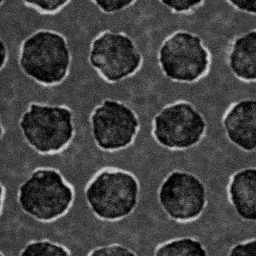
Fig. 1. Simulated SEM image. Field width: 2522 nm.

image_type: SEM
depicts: a regular array of holes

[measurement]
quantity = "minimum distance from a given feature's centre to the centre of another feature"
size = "658 nanometers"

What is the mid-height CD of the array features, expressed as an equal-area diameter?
0.476 microns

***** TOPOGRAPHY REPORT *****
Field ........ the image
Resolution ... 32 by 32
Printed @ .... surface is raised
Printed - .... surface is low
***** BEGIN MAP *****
@@@@----@@@@----@@@@@---@@@@@---
@@@@@@@@@@@@@@@@@@@@@@@@@@@@@@@-
@@@@@@@@@@@@@@@@@@@@@@@@@@@@@@@@
@@@@@@@@@@@@@@@@@@@@@@@@@@@@@@@@
@@@@----@@@@---@@@@@@@--@@@@@@@-
@@@-----@@@------@@@-----@@@@---
-@@------@@------@@@------@@@---
-@@------@@------@@@------@@@---
@@@-----@@@@-----@@@------@@@---
@@@@----@@@@@---@@@@@----@@@@@--
@@@@@@@@@@@@@@@@@@@@@@@@@@@@@@@@
@@@@@@@@@@@@@@@@@@@@@@@@@@@@@@@@
@@@@@@@@@@@@@@@@@@@@@@@@@@@@@@@@
@@@@----@@@@----@@@@@---@@@@@---
@@@------@@@-----@@@-----@@@----
@@@------@@@-----@@-------@@----
@@@------@@@-----@@------@@@----
@@@------@@@----@@@@-----@@@@---
@@@@----@@@@@--@@@@@@--@@@@@@@--
@@@@@@@@@@@@@@@@@@@@@@@@@@@@@@@@
@@@@@@@@@@@@@@@@@@@@@@@@@@@@@@@@
@@@@---@@@@@@--@@@@@@@@@@@@@@@--
@@@@----@@@@-----@@@@----@@@@---
@@@------@@------@@@-----@@@@---
@@-------@@------@@@------@@@---
@@@------@@------@@@------@@@---
@@@-----@@@@----@@@@@----@@@@@--
@@@@@-@@@@@@@@@@@@@@@@--@@@@@@@@
@@@@@@@@@@@@@@@@@@@@@@@@@@@@@@@@
@@@@@@@@@@@@@@@@@@@@@@@@@@@@@@@@
@@@@---@@@@@@@@@@@@@-----@@@@@@-
@@@-----@@@@----@@@@------@@@---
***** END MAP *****